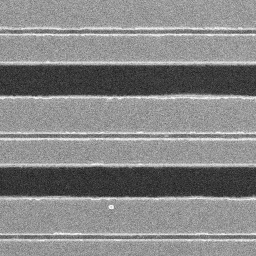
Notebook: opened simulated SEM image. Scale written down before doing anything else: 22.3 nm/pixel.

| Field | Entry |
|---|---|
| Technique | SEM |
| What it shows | lines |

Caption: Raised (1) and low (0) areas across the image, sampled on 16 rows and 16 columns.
1111111111111111
1111111111111111
1111111111111111
1111111111111111
0000000000000000
0000000000000000
1111111111111111
1111111111111111
1111111111111111
1111111111111111
0000000000000000
0000000000000000
1111111111111111
1111111111111111
1111111111111111
1111111111111111